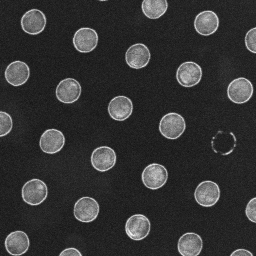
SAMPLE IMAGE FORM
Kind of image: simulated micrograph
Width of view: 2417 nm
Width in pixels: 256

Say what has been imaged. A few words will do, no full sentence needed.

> a regular array of holes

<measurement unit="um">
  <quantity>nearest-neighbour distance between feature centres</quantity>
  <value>0.506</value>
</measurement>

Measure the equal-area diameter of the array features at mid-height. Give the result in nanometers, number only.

221